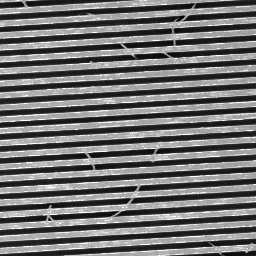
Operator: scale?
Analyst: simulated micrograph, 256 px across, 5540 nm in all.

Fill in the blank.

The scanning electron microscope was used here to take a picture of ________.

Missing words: parallel lines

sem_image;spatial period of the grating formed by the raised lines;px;11.9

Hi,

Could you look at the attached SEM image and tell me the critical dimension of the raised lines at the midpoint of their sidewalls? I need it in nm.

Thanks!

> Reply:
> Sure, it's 146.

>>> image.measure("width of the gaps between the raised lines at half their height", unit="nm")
111